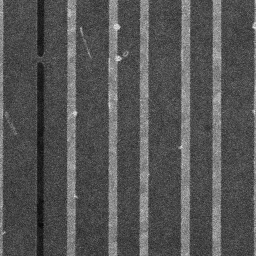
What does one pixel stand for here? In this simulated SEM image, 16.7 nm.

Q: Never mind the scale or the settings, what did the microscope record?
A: parallel lines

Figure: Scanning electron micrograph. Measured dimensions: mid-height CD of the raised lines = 0.13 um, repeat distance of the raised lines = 590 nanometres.